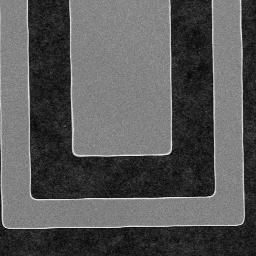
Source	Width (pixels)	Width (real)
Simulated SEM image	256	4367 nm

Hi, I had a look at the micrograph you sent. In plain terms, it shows groups of lines, slits or small figures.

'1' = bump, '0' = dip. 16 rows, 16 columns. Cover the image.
1100111111100110
1100111111100110
1100111111100110
1100111111100110
1100111111100110
1100111111100110
1100111111100110
1100011111100110
1100011111100110
1100011111000110
1100000000000110
1100000000000110
1111111111111110
1111111111111110
0000000000000000
0000000000000000